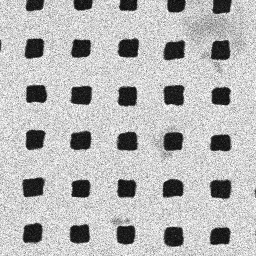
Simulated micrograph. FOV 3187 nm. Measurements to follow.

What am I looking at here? a regular array of holes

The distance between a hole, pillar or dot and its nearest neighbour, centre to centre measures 569 nm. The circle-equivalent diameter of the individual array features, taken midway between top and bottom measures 250 nanometers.